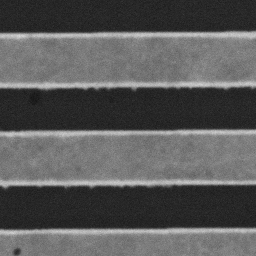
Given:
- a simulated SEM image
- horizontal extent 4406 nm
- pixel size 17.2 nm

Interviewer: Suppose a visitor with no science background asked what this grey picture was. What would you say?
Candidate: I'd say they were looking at lines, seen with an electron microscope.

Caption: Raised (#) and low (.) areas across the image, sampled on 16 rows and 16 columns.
................
................
################
################
################
................
................
................
################
################
################
################
................
................
################
################